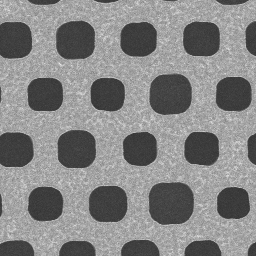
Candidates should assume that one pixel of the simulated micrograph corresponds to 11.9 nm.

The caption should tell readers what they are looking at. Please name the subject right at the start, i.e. a regular array of holes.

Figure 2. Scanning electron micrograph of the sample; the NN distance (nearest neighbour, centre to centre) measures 0.743 um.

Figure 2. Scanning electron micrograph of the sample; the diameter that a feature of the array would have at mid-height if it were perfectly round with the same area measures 440 nanometers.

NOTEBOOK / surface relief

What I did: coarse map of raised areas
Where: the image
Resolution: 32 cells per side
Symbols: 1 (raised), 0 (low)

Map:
11110001111111111111111111110011
11111111111111111111111111111111
11111111111111111111111111111111
00001110000011100001111000011110
00001110000011100000111000011110
00001110000011100000111000011110
00001110000011110001111000011110
11111111111111111111111111111111
11111111111111111111111111111111
11111111111111111111000111111111
11110000111100011110000011100001
11100000111000001110000011100001
11100000111000001110000011100001
11110001111100011110000011110001
11111111111111111111111111111111
11111111111111111111111111111111
10111111000111111111111100111111
00001110000011110001111000011110
00001110000011100000111000011110
00001110000011100001111000011110
00011111000111110001111100111111
11111111111111111111111111111111
11111111111111111111111111111111
11111001111100011110000011110011
11110000111000001110000011100001
11100000111000001110000011100001
11110000111000001110000011100001
11111011111100011110000111111111
11111111111111111111111111111111
11111111111111111111111111111111
00001111000111110001111100011111
00001110000011100000111000001110